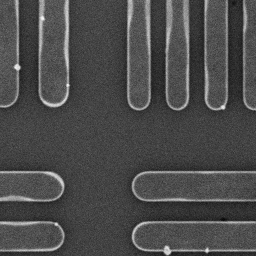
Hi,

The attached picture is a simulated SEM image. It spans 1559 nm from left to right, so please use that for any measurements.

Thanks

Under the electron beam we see groups of lines, slits or small figures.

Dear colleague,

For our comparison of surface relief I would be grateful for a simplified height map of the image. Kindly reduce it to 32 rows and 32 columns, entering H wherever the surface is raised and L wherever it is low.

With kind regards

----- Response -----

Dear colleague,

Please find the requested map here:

HHLLLHHHLLLLLLLLHHLLLHHLLLHHLLHH
HHLLLHHHLLLLLLLLHHLLLHHLLLHHLLLH
HHLLLHHHLLLLLLLLHHLLLHHLLLHHLLLH
HHLLLHHHLLLLLLLLHHLLLHHLLLHHLLLH
HHLLLHHHLLLLLLLLHHHLLHHLLLHHLLLH
HHLLLHHHLLLLLLLLHHHLLHHHLLHHLLLH
HHLLLHHHLLLLLLLLHHHLLHHHLLHHLLLH
HHLLLHHHLLLLLLLLHHHLLHHHLLHHLLLH
HHLLLHHHHLLLLLLLHHHLLHHHLLHHLLLH
HHLLLHHHHLLLLLLLHHHLLHHLLLHHLLLH
HHLLLHHHHLLLLLLLHHHLLHHLLLHHLLLH
HHLLLHHHHLLLLLLLHHHLLHHHLLHHLLLH
HHLLLHHHLLLLLLLLHHHLLHHHLLHHLLLH
LLLLLLLLLLLLLLLLLHLLLLHLLLHHLLLH
LLLLLLLLLLLLLLLLLLLLLLLLLLLLLLLL
LLLLLLLLLLLLLLLLLLLLLLLLLLLLLLLL
LLLLLLLLLLLLLLLLLLLLLLLLLLLLLLLL
LLLLLLLLLLLLLLLLLLLLLLLLLLLLLLLL
LLLLLLLLLLLLLLLLLLLLLLLLLLLLLLLL
LLLLLLLLLLLLLLLLLLLLLLLLLLLLLLLL
LLLLLLLLLLLLLLLLLLLLLLLLLLLLLLLL
HHHHHHLLLLLLLLLLLLHHHHHHHHHHHHHH
HHHHHHHHLLLLLLLLLHHHHHHHHHHHHHHH
HHHHHHHHLLLLLLLLLHHHHHHHHHHHHHHH
HHHHHHHHLLLLLLLLLHHHHHHHHHHHHHHH
LLLLLLLLLLLLLLLLLLLLLLLLLLLLLLLL
LLLLLLLLLLLLLLLLLLLLLLLLLLLLLLLL
LLLLLLLLLLLLLLLLLLLLLLLLLLLLLLLL
HHHHHHHHLLLLLLLLLHHHHHHHHHHHHHHH
HHHHHHHHLLLLLLLLLHHHHHHHHHHHHHHH
HHHHHHHHLLLLLLLLLHHHHHHHHHHHHHHH
LLLLLLLLLLLLLLLLLLLLHHLLLLLLLLLL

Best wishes